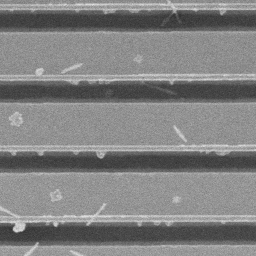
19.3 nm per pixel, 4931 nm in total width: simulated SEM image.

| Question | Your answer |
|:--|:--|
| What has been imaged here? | lines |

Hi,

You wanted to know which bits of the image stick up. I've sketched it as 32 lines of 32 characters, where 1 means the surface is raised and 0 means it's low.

11111111111111111111111111111111
00000000000001001000000000010000
00000000000000000000000000000000
00000000000000000000000000000000
11111111111111111111111111111111
11111111111111111111111111111111
11111111111111111111111111111111
11111111111111111111111111111111
11111111111111111111111111111111
11111111111111111111111111111111
00000000000000000000000000000000
00000000000000000000000000000000
00000000000000000000000000000000
11111111111111111111111111111111
11111111111111111111111111111111
11111111111111111111111111111111
11111111111111111111111111111111
11111111111111111111111111111111
11111111111111111111111111111111
00000000000010000000000000000000
00000000000000000000000000000000
00000000000000000000000000000000
11111111111111111111111111111111
11111111111111111111111111111111
11111111111111111111111111111111
11111111111111111111111111111111
11111111111111111111111111111111
11111111111111111111111111111111
00100000000000000000000000000000
00000000000000000000000000000000
00000000000000000000000000000000
11111111111111111111111111111111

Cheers